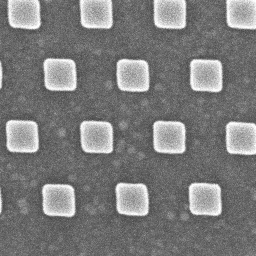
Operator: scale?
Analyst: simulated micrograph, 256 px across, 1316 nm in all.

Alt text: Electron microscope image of a regular array of raised bodies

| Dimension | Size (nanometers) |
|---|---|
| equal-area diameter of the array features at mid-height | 176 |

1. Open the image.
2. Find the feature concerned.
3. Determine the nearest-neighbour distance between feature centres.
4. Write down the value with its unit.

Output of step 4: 368 nanometers